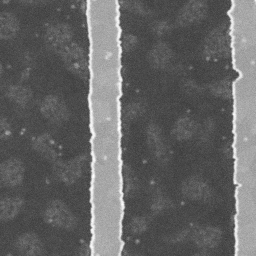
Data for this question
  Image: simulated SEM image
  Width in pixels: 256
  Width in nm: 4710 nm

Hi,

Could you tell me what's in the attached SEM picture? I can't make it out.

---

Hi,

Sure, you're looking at one or a few lines or trenches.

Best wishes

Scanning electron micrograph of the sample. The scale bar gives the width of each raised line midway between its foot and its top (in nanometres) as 538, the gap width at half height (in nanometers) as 2090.